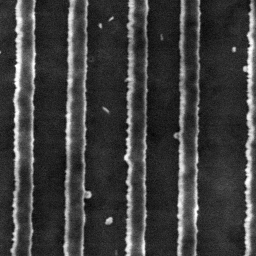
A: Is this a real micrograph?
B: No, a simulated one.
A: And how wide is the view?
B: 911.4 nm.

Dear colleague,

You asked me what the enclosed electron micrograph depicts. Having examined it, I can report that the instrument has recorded lines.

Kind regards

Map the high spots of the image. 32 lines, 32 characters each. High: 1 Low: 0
00110000011000001100000110000001
00110000011000001100000110000001
00110000011000001100000110000001
00110000011000001100000110000001
00110000011000001100000110000001
00110000011000001100000110000001
00110000011000001100000110000001
00110000011000001100000110000001
00110000011000001100000110000001
00110000011000001100000110000001
00110000011000001100000110000001
00110000011000001100000110000001
00110000111000001100000110000001
00110000111000001100000110000001
00110000111000001100000110000001
00110000111000001100000110000001
00110000111000001100001110000001
00110000111000001100001110000001
00110000111000001100001110000001
00110000110000001100000110000001
00110000111000001100000110000001
00110000111000001100000110000001
00110000110000001100001110000001
00110000111000001100001110000001
00110000111000001100001110000001
00110000110000001100001110000001
00110000111000001100001110000001
00110000111000001100001100000001
00110000110000001100001110000001
00110000110000001100001110000001
00110000110000001100001110000001
01110000110000001100001110000001